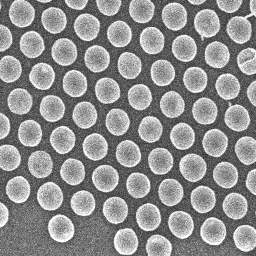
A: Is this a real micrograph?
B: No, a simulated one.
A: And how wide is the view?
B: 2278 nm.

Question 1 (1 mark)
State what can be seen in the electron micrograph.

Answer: a regular array of raised bodies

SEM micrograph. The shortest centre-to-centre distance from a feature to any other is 293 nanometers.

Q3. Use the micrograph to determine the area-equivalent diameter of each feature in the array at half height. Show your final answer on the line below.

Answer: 25.1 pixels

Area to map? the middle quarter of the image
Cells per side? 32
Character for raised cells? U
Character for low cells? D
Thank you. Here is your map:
DDDDDDUUUUUDDDUUUUUDDDUUUUUDDDDD
DDDDDDDUUUDDDDUUUUUDDDUUUUUDDDDU
DUUUDDDDDDDDDDUUUUUDDDUUUUUUDDUU
UUUUUDDDDDDDDDDDUDDDDDUUUUUDDDUU
UUUUUUDDUUUUUDDDDDDDDDDUUUUDDDUU
UUUUUUDDUUUUUUDDDDUUDDDDDDDDDDUU
UUUUUDDDUUUUUUDDDUUUUDDDDDDDDDDU
DUUUUDDDUUUUUUDDUUUUUUDDDUUUDDDD
DDDDDDDDDUUUUUDDUUUUUUDDUUUUUDDD
DDDDDDDDDDUUDDDDUUUUUUDDUUUUUUDD
DDDUUUUDDDDDDDDDDUUUUDDDUUUUUUDD
DDDUUUUUDDDDUUDDDDDDDDDDUUUUUUDD
DDUUUUUUDDDUUUUUDDDDDDDDDUUUUDDD
DDUUUUUUDDDUUUUUDDDDUUUDDDDDDDDD
DDDUUUUUDDDUUUUUDDDUUUUUDDDDDDDD
DDDDUUUDDDDUUUUUDDDUUUUUDDDDUUUD
UDDDDDDDDDDUUUUUDDDUUUUUUDDUUUUU
UUDDDDDDDDDDUUUDDDDUUUUUDDDUUUUU
UUUDDDUUUUDDDDDDDDDUUUUUDDDUUUUU
UUUDDUUUUUDDDDUUUDDDDUDDDDDUUUUU
UUDDDUUUUUUDDDUUUUDDDDDDDDDDUUUU
UUDDDUUUUUUDDUUUUUUDDDUUUUDDDDDD
DDDDDUUUUUDDDUUUUUUDDUUUUUDDDDDD
DDDDDDUUUUDDDUUUUUUDDUUUUUUDDDUU
UUUUDDDDDDDDDDUUUUUDDUUUUUUDDUUU
UUUUUDDDDDUDDDDUUDDDDUUUUUUDDUUU
UUUUUDDDUUUUUDDDDDDDDDUUUUDDDUUU
UUUUUDDUUUUUUDDDDUUDDDDUUDDDDDUU
UUUUUDDUUUUUUDDDUUUUUDDDDDDDDDUU
DUUUDDDUUUUUUDDDUUUUUDDDDUUUUDDD
DDDDDDDDUUUUUDDDUUUUUDDDUUUUUDDD
DDDDDDDDDUUUDDDDUUUUUDDDUUUUUUDD